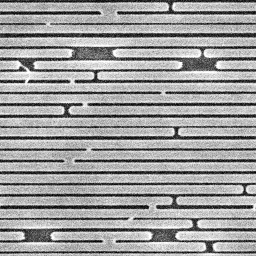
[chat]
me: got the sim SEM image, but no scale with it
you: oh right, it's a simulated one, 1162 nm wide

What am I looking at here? parallel lines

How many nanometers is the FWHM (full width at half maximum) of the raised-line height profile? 37.4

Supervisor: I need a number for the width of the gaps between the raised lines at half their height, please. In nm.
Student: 16.4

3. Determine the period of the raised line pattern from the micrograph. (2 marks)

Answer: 0.0519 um